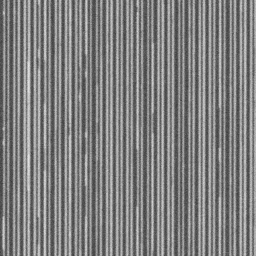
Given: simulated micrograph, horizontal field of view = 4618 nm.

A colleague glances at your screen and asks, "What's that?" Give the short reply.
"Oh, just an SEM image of parallel lines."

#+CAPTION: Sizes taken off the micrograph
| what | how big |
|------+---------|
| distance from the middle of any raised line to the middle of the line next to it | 92.7 nm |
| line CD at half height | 24.8 nanometres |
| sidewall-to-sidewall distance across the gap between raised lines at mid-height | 49.6 nm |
